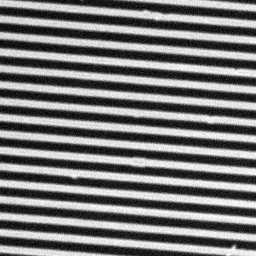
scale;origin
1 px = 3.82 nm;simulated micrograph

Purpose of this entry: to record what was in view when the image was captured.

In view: parallel lines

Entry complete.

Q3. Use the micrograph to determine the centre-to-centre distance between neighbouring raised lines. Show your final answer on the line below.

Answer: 16.3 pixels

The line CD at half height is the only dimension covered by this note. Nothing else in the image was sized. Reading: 22.8 nm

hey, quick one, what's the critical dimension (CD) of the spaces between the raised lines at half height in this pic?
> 39.4 nm